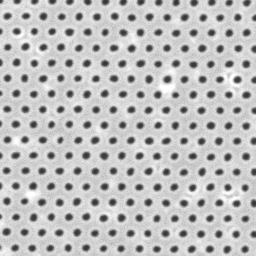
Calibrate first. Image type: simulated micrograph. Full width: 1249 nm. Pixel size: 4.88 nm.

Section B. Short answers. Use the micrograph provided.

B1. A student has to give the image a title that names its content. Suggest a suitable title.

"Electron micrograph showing a regular array of holes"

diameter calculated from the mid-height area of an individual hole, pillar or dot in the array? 37.7 nm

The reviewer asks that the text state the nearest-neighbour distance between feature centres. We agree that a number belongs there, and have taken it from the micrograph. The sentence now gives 84.2 nm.